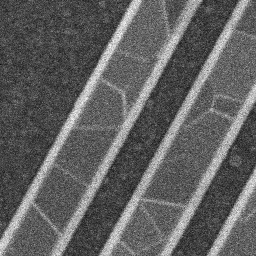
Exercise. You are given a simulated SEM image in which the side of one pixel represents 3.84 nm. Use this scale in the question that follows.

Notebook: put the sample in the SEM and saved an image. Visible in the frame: one or a few lines or trenches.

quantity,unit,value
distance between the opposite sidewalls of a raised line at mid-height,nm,201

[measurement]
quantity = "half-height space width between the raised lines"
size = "42.3 pixels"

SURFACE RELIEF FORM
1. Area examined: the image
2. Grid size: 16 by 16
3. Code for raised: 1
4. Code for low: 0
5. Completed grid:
0000000011110001
0000000011100001
0000000111100011
0000000111000111
0000001111000111
0000001110001111
0000011110001111
0000111100011110
0000111100011100
0001111000111100
0001110000111000
0011110001111000
0011100011110001
0111100011110001
0111000111100011
1111000111100011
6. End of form